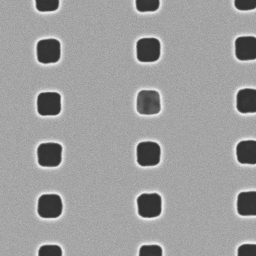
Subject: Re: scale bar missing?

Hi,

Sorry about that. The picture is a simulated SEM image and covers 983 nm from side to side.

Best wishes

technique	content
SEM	a regular array of holes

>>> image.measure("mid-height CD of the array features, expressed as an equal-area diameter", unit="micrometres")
0.0972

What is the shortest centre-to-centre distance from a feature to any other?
198 nanometers